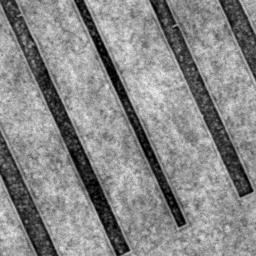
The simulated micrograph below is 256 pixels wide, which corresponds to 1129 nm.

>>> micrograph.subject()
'one or a few lines or trenches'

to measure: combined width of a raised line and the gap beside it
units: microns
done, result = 0.294